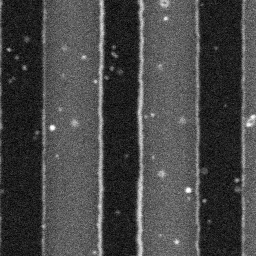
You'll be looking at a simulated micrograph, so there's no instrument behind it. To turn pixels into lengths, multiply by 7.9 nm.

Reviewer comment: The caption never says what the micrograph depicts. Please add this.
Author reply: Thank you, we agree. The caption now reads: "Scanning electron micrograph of lines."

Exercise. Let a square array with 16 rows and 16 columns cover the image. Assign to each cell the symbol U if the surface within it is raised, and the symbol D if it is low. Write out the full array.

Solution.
UUUDDDUUUDDDUUUD
UUUDDDUUUDDDUUUD
UUUDDDUUUDDDUUUD
UUUDDDUUUDDDUUUD
UUUDDDUUUDDDUUUD
UUUDDDUUUDDDUUUD
UUUDDDUUUDDDUUUD
UUUDDDUUUDDDUUUD
UUUDDDUUUDDDUUUD
UUUDDDUUUDDDUUUD
UUUDDDUUUDDDUUUD
UUUDDDUUUDDDUUUD
UUUDDDUUUDDDUUUD
UUUDDDUUUDDDUUUD
UUUDDDUUUDDDUUUD
UUUDDDUUUDDDUUUD